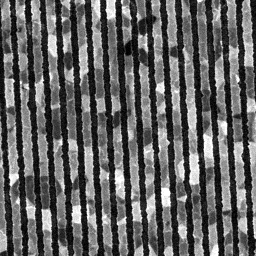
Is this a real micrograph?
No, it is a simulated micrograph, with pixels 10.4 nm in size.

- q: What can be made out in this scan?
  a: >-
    parallel lines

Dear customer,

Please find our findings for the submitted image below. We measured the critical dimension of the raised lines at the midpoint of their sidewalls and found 86.6 nanometers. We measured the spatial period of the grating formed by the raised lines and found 156 nanometres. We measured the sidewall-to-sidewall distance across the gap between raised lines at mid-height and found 71.1 nanometres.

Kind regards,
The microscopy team